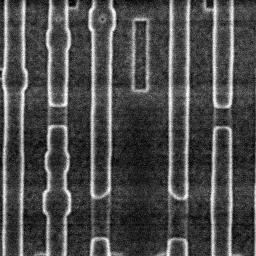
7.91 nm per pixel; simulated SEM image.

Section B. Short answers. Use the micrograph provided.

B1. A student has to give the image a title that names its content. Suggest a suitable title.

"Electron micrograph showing wiring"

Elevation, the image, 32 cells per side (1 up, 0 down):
01100011000011000000011100011000
01100011000111000000011100011000
01100011000111000000011100011000
01100011100111000000011100011000
01100011100011000000011100011000
01100011100011000000011100011000
01100011100011000000011100011000
01100011000011000000011100011000
01100011000011000000011000011000
11100011000011000000011000011000
11100011000011000000011000011000
01100011000011000000011000011000
01100011000011000000011000011000
01100000000111000000011000000000
01100000000111000000011000000000
01100000000111000000011000000000
01100011000111000000011000011000
01100011000111000000011000011000
11100011000111000000011000011000
11100011100111000000011000011000
11100011100111000000011000011000
11100011000111000000011000011000
11100011000111000000011000011000
11100011000111000000011000011000
11100111100010000000001000111000
11100111100000000000000000111000
11100011100000000000000000111000
11100011000000000000000000111000
11100011000000000000000000011000
11100011000000000000000000011000
11100011000111000000011000011000
11100011000111000000011000011000